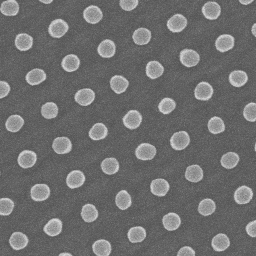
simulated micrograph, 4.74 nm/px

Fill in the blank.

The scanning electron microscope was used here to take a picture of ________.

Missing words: a regular array of raised bodies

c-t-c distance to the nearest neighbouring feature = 36.3 pixels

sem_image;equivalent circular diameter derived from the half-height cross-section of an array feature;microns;0.0826